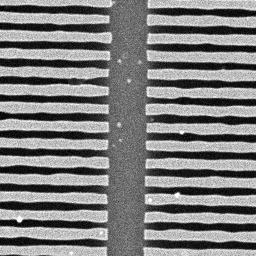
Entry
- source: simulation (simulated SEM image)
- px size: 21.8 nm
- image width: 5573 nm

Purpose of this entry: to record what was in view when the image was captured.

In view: groups of lines, slits or small figures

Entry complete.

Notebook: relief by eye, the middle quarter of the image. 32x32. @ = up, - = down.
--------------------------------
@@@@@@@@@@---------------@@@----
@@@@@@@@@@@----------@@@@@@@@@@@
-----@----------------@@@@@@@@@@
--------------------------------
@@@@@@@@@-----------------------
@@@@@@@@@@@----------@@@@@@@@@@@
@@@@@@@@@@@----------@@@@@@@@@@@
-------------------------@@@----
--------------------------------
@@@@@@@@@@@----------@@@@@@@@@@@
@@@@@@@@@@@----------@@@@@@@@@@@
---------------------@@@@--@@@@@
--------------------------------
@-------------------------------
@@@@@@@@@@@----------@@@@@@@@@@@
@--@@@@@@@@----------@@@@@@@@@@@
--------------------------------
--------------------------------
@@@@@@@@@@@----------@@@@@@@@@--
@@@@@@@@@@@----------@@@@@@@@@@@
---------------------@@@@@@@@@@@
--------------------------------
@@@@@-@@@@@---------------------
@@@@@@@@@@@----------@@@@@@@@@@@
@@@@@@@@@@@----------@@@@@@@@@@@
--------------------------------
--------------------------------
@@@@@@@@@@@---------@@@@@@@@@@--
@@@@@@@@@@@---------@@@@@@@@@@@@
-----------------------@@@@@@@@@
--------------------------------